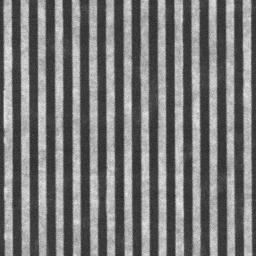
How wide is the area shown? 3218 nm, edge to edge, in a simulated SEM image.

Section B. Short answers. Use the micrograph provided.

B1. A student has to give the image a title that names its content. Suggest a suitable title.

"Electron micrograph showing parallel lines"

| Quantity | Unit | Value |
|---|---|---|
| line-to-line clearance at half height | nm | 121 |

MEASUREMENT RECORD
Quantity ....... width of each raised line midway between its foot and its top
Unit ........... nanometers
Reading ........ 94.2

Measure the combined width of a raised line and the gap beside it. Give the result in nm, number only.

215